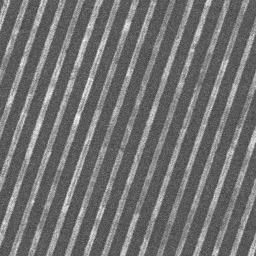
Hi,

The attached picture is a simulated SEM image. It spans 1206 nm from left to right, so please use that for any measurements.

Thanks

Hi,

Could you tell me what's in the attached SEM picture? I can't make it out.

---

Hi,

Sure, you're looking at parallel lines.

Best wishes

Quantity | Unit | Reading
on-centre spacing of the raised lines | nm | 81.7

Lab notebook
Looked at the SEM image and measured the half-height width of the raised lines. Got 21.7 nanometers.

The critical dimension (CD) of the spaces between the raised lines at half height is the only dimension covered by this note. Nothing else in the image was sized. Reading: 0.0603 microns